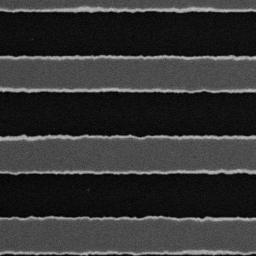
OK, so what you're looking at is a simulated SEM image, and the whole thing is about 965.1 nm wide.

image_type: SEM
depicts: lines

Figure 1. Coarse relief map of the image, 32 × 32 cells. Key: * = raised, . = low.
********************************
................................
................................
................................
................................
................................
................................
********************************
********************************
********************************
********************************
.......................*........
................................
................................
................................
................................
................................
********************************
********************************
********************************
********************************
********************************
................................
................................
................................
................................
................................
********************************
********************************
********************************
********************************
********************************